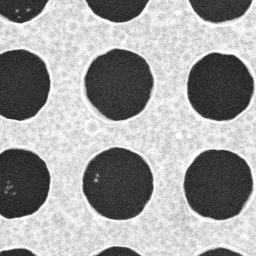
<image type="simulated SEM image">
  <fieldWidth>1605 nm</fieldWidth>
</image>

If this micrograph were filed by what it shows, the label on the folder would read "holes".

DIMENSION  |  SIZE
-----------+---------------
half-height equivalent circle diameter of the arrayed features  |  449 nm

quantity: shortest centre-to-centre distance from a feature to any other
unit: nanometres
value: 616